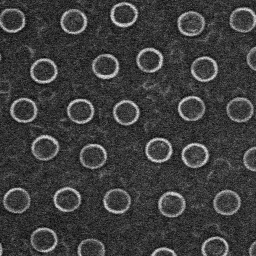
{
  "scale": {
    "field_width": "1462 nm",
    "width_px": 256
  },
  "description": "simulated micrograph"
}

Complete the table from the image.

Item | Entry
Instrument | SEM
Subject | a regular array of raised bodies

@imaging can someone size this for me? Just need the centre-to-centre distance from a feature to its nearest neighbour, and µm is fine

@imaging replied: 0.262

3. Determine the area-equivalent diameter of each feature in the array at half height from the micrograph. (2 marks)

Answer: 145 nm